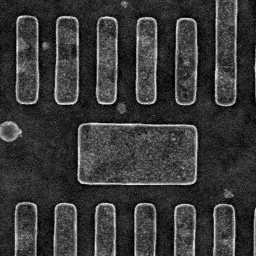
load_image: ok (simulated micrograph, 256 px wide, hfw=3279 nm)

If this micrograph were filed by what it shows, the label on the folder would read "wiring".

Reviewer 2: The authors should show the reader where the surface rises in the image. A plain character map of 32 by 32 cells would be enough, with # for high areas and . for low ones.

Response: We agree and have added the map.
...........................###..
...........................###..
..###..##...##....#...##...##...
..###..###..###..###..##...##...
..###..###..###..###..##...##...
..###..###..###..###..##...##...
..###..###..###..###..###..##...
..###..###..###..###..###..##...
..###..###..###..##...##...##...
..###..###..###..##...##...##...
..###..###..##...##...##...##...
..###..###..##...##...##...##...
..###..##...##...##...##...##...
................................
................................
................................
..........##############........
..........##############........
..........##############........
..........##############........
..........##############........
..........##############........
..........##############........
................................
................................
..##....#.........#.............
..###..##...##...##...##...##...
..###..##...##...##...##...##...
..###..##...##...##...##...##...
..###..##...##...##...##...##...
..##...##...##...##...##...##...
..##...##...##...##...##...##...